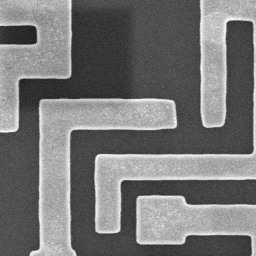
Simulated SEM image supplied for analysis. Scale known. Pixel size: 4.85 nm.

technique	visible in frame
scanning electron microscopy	wiring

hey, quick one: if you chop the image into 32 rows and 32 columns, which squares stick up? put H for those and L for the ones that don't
HHHHHHHHHLLLLLLLLLLLLLLLLHHHHHHH
HHHHHHHHHLLLLLLLLLLLLLLLLHHHHHHH
HHHHHHHHHLLLLLLLLLLLLLLLLHHHHLLH
LLLLHHHHHLLLLLLLLLLLLLLLLHHHLLLL
LLLLLHHHHLLLLLLLLLLLLLLLLHHHLLLL
LLLLHHHHHLLLLLLLLLLLLLLLLHHHLLLL
HHHHHHHHHLLLLLLLLLLLLLLLLHHHLLLL
HHHHHHHHHLLLLLLLLLLLLLLLLHHHLLLL
HHHHHHHHHLLLLLLLLLLLLLLLLHHHLLLL
HHHHHHHHHLLLLLLLLLLLLLLLLHHHLLLL
HHLLLLLLLLLLLLLLLLLLLLLLLHHHLLLL
HHLLLLLLLLLLLLLLLLLLLLLLLHHHLLLL
HHLLLLLHHHHHHHHHLHHHLLLLLHHHLLLL
HHLLLHHHHHHHHHHHHHHHHHLLLHHHLLLL
HHLLLHHHHHHHHHHHHHHHHHLLLHHHLLLL
HHLLLHHHHHHHHHHHHHHHHHLLLHHHLLLL
LLLLLHHHHLLLLLLLLLLLLLLLLLLLLLLL
LLLLLHHHHLLLLLLLLLLLLLLLLLLLLLLL
LLLLLHHHHLLLLLLLLLLLLLLLLLLLLLLL
LLLLLHHHHLLLHHHHHHHHHHHHHHHHHHHH
LLLLLHHHHLLLHHHHHHHHHHHHHHHHHHHH
LLLLLHHHHLLLHHHHHHHHHHHHHHHHHHHH
LLLLLHHHHLLLHHHHLLLLLLLLLLLLLLLL
LLLLLHHHHLLLHHHLLLLLLLLLLLLLLLLL
LLLLLHHHHLLLHHHLLLHHLLLLLLLLLLLL
LLLLLHHHHLLLHHHLLHHHHHHHLLLLLLLL
LLLLLHHHHLLLHHHLLHHHHHHHHHHHHHHH
LLLLLHHHHLLLHHHLLHHHHHHHHHHHHHHH
LLLLLHHHHLLLHHHLLHHHHHHHHHHHHHHH
LLLLLHHHHLLLLLLLLHHHHHHHLLLLLLLH
LLLLLHHHHLLLLLLLLLLLLLLLLLLLLLLH
LLLLHHHHHLLLLLLLLLLLLLLLLLLLLLLH